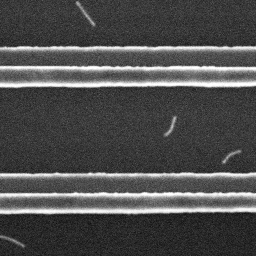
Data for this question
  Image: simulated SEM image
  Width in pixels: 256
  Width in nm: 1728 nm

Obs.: lines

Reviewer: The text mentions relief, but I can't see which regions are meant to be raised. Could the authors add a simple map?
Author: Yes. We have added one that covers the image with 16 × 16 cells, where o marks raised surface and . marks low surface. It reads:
................
................
................
oooooooooooooooo
oooooooooooooooo
................
................
................
................
................
................
oooooooooooooooo
oooooooooooooooo
................
................
................